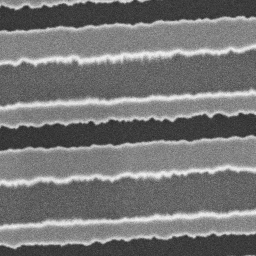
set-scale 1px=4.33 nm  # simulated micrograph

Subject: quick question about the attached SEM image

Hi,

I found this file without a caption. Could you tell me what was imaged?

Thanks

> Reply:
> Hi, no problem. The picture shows lines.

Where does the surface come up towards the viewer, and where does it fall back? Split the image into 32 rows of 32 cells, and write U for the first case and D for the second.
UUUUUUUDUDDDDDDDDDDDDDDDDDDDDDDD
DDDDDDDDDDDDDDDDDDDDDDDDDDDDDDDD
DDDDDDDDDDDDDDDDDDDDDDDUDUUUUUUU
DDDDDDDUUDUUUUUUUUUUUUUUUUUUUUUU
UUUUUUUUUUUUUUUUUUUUUUUUUUUUUUUU
UUUUUUUUUUUUUUUUUUUUUUUUUUUUUUUU
UUUUUUUUUUUUUUUUUUUUUUDUUDDUDDDD
UUUUUUDDDDUUDDDDDDDDDDDDDDDDDDDD
DDDDDDDDDDDDDDDDDDDDDDDDDDDDDDDD
DDDDDDDDDDDDDDDDDDDDDDDDDDDDDDDD
DDDDDDDDDDDDDDDDDDDDDDDDDDDDDDDD
DDDDDDDDDDDDDDDDDDDDDDDDDDDDDDDD
DDDDDDDDDDDDDDDUUDUUUUUUUUUUUUUU
UUUUUUUUUUUUUUUUUUUUUUUUUUUUUUUU
UUUUUUUUUUUUUUUUUUUUUUUUDDDDDDDD
UUUUUUUDUDDDDDDDDDDDDDDDDDDDDDDD
DDDDDDDDDDDDDDDDDDDDDDDDDDDDDDDD
DDDDDDDDDDDDDDDDDDDDDDDDDUUUUUUU
DDDUDDDUDUUUUUUUUUUUUUUUUUUUUUUU
UUUUUUUUUUUUUUUUUUUUUUUUUUUUUUUU
UUUUUUUUUUUUUUUUUUUUUUUUUUUUUUUU
UUUUUUUUUUUUUUUUUUUUUUUUDDDDDDDD
UUUUUDDUUDDDDDDDDDDDDDDDDDDDDDDD
DDDDDDDDDDDDDDDDDDDDDDDDDDDDDDDD
DDDDDDDDDDDDDDDDDDDDDDDDDDDDDDDD
DDDDDDDDDDDDDDDDDDDDDDDDDDDDDDDD
DDDDDDDDDDDDDDDDDDDDDDDDDDDDDDDD
DDDDDDDDDDDDDDDUUUUUUUUUUUUUUUUU
UUUUUUUUUUUUUUUUUUUUUUUUUUUUUUUU
UUUUUUUUUUUUUUUUUUUUUUDDUUDDDDDD
UUUUUUDUDDUDDDDDDDDDDDDDDDDDDDDD
DDDDDDDDDDDDDDDDDDDDDDDDDDDDDDDD